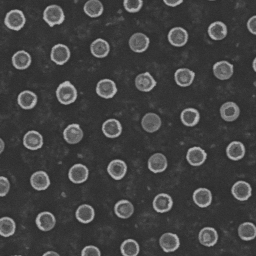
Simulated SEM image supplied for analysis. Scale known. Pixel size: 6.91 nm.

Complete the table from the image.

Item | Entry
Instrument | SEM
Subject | a regular array of raised bodies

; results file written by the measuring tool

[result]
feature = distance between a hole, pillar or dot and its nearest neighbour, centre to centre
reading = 271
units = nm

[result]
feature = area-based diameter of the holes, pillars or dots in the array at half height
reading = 134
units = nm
